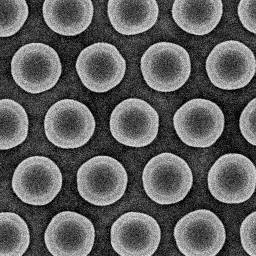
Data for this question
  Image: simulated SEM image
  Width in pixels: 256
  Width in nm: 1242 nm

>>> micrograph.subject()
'an array of small figures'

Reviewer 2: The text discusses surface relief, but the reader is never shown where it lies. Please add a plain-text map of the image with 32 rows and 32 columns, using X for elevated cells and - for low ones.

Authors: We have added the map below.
XXX--XXXXXXX--XXXXXX--XXXXXX--XX
XXX--XXXXXXX--XXXXXX--XXXXXX--XX
XXX---XXXXX---XXXXXX--XXXXX---XX
XXX---XXXXX---XXXXX----XXXX----X
X-------------------------------
----X-------XX-----XXX-----XXX--
--XXXXX---XXXXX---XXXXX---XXXXX-
--XXXXX---XXXXX---XXXXXX--XXXXXX
-XXXXXXX--XXXXXX--XXXXXX--XXXXXX
--XXXXX---XXXXX---XXXXXX--XXXXXX
--XXXXX----XXXX---XXXXX----XXXX-
----X---------------------------
X-------X-------XX------XX------
XXX---XXXXX---XXXXX----XXXX----X
XXX---XXXXXX--XXXXXX--XXXXXX--XX
XXX---XXXXXX--XXXXXX--XXXXXX--XX
XXX---XXXXXX--XXXXXX--XXXXXX--XX
XXX---XXXXX----XXXX----XXXX----X
X-------------------------------
--------------------XX------XX--
--XXXXX---XXXXX---XXXXX----XXXXX
--XXXXX---XXXXXX--XXXXXX--XXXXXX
--XXXXXX--XXXXXX--XXXXXX--XXXXXX
--XXXXXX--XXXXXX--XXXXXX--XXXXXX
--XXXXX---XXXXX----XXXX----XXXX-
----XX------XX------------------
--------X---------------XX------
XXX----XXXX----XXXX----XXXX----X
XXX---XXXXXX--XXXXXX--XXXXXX--XX
XXXX--XXXXXX--XXXXXX--XXXXXX--XX
XXXX--XXXXXX--XXXXXX--XXXXXX--XX
XXX---XXXXX----XXXX----XXXX----X